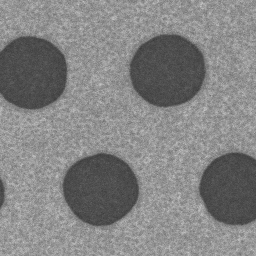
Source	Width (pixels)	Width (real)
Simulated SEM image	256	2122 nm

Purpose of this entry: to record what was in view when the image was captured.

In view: holes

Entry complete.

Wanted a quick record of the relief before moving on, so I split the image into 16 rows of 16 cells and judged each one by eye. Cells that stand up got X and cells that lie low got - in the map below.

XXXXXXXXXXXXXXXX
XXXXXXXXXXXXXXXX
X--XXXXXX---XXXX
----XXXX-----XXX
----XXXX-----XXX
----XXXX-----XXX
X--XXXXXX--XXXXX
XXXXXXXXXXXXXXXX
XXXXXXXXXXXXXXXX
XXXXXXXXXXXXXXXX
XXXX----XXXXX---
XXXX-----XXX----
XXXX-----XXXX---
XXXXX---XXXXX---
XXXXXXXXXXXXXXXX
XXXXXXXXXXXXXXXX